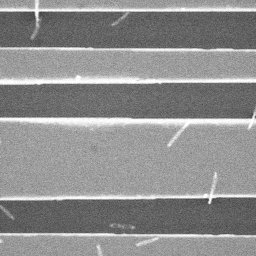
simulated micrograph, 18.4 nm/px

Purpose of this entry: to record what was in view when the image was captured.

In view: lines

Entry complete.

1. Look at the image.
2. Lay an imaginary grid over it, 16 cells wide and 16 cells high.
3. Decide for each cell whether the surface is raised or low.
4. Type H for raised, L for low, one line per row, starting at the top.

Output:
HHHHHHHHHHHHHHHH
LLLLLLLLLLLLLLLL
LLLLLLLLLLLLLLLL
HHHHHHHHHHHHHHHH
HHHHHHHHHHHHHHHH
LLLLLLLLLLLLLLLL
LLLLLLLLLLLLLLLL
HHHHHHHHHHHHHHHH
HHHHHHHHHHHHHHHH
HHHHHHHHHHHHHHHH
HHHHHHHHHHHHHHHH
HHHHHHHHHHHHHHHH
LLLLLLLLLLLLLLLL
LLLLLLLLLLLLLLLL
LLLLLLLLLLLLLLLL
HHHHHHHHHHHHHHHH